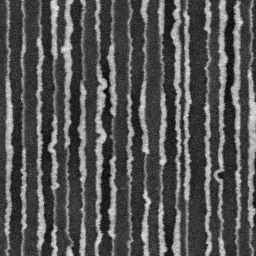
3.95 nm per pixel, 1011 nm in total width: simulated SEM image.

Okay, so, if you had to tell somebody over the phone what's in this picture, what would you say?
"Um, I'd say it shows parallel lines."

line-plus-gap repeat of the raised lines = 120 nm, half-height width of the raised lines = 72.6 nanometers